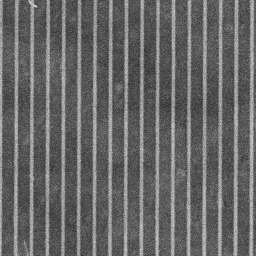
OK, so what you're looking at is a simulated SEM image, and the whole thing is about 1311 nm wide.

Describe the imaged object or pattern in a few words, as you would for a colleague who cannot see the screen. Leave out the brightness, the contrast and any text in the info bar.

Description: parallel lines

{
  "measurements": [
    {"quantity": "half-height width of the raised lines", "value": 14.1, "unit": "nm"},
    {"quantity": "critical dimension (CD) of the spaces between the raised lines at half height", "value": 65.9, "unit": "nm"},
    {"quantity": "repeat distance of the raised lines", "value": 80.4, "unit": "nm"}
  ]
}